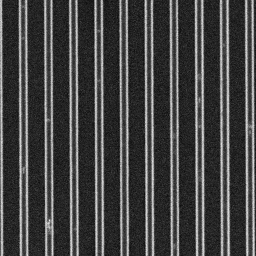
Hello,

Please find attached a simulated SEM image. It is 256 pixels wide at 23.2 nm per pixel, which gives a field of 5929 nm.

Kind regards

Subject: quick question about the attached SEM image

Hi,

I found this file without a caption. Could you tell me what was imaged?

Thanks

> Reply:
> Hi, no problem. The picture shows parallel lines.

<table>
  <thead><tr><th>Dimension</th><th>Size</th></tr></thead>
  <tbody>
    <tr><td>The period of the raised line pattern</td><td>25.2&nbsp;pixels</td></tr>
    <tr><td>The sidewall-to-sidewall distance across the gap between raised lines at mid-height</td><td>411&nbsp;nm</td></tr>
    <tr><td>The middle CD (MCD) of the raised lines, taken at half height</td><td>0.159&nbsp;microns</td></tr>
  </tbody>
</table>